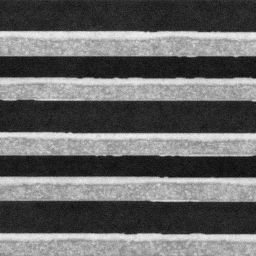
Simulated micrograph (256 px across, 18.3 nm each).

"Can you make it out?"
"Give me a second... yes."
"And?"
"lines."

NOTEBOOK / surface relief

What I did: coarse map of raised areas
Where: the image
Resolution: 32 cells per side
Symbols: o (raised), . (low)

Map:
................................
................................
................................
................................
oooooooooooooooooooooooooooooooo
oooooooooooooooooooooooooooooooo
oooooooooooooooooooooooooooooooo
................................
................................
................................
oooooooooooooooooooooooooooooooo
oooooooooooooooooooooooooooooooo
...............................o
................................
................................
................................
................................
oooooooooooooooooooooooooooooooo
oooooooooooooooooooooooooooooooo
................................
................................
................................
oooooooooooooooooooooooooooooooo
oooooooooooooooooooooooooooooooo
oooooooooooooooooooooooooooooooo
................................
................................
................................
................................
ooooooooooooooooooooooooooooo...
oooooooooooooooooooooooooooooooo
oooooooooooooooooooooooooooooooo